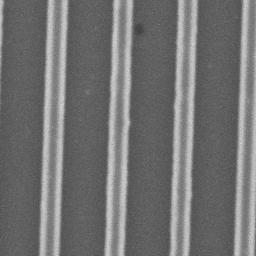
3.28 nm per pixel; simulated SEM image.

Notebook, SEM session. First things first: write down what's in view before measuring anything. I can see one or a few lines or trenches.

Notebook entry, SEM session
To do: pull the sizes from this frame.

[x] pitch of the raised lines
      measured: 213 nanometers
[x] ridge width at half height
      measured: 48 nm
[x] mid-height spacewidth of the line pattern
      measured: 0.164 µm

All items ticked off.